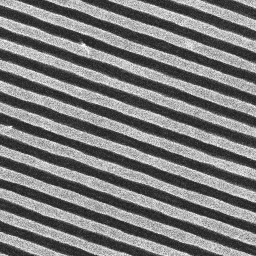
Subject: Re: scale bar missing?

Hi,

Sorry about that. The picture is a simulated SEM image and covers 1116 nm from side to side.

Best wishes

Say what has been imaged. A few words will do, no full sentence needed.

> parallel lines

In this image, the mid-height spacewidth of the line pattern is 0.0391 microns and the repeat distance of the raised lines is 88.8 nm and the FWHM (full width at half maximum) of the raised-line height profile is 47.8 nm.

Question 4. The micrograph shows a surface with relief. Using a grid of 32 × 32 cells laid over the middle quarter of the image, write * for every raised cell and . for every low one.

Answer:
****........********.......*****
*******........********.......**
...*******.......*********......
.....********.......********....
.......*********.......********.
***........********.......******
*******.......********......****
.********.......*********......*
...*********.......*********....
......********.......**********.
***......********.......********
******.......********.......****
********.......*********......**
...********.......*********.....
......********......*********...
*.......*********......*********
****.......********.......******
*******........*******.......***
.*********.......********.......
....*********.......********....
*......**********......********.
***........********......*******
******.......*********......****
.*******........********.......*
....********.......********.....
......*********......*********..
**......*********.......********
*****.......*********......*****
********.......********.......**
...********.......*******.......
.....*********.......*******....
**......*********.......*******.